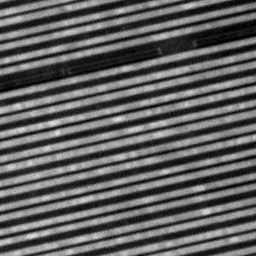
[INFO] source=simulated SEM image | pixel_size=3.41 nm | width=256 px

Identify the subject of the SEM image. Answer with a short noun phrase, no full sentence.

parallel lines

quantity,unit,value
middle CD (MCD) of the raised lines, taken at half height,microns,0.0187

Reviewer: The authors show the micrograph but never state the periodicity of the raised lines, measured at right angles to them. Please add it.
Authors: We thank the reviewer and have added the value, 11.9 px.